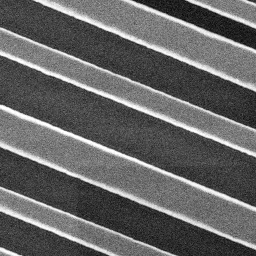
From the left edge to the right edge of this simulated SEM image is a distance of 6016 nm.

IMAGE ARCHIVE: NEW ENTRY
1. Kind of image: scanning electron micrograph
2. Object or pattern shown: lines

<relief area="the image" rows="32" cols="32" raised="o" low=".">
.....oooooooooooo.......oooooooo
........oooooooooooo.......ooooo
..........oooooooooooo.......ooo
.............oooooooooooo.......
ooo............ooooooooooooo....
ooooo.............oooooooooooo..
oooooooo............oooooooooooo
..oooooooo............oooooooooo
....oooooooo.............ooooooo
.......oooooooo............ooooo
.........ooooooooo............oo
............oooooooo............
..............ooooooooo.........
o................oooooooo.......
ooo................ooooooooo....
oooooo................oooooooo..
oooooooo................oooooooo
ooooooooooo................ooooo
ooooooooooooo................ooo
...ooooooooooooo................
.....ooooooooooooo..............
........ooooooooooooo...........
..........ooooooooooooo.........
.............ooooooooooooo......
ooo............ooooooooooooo....
oooooo............ooooooooooooo.
oooooooo............oooooooooooo
...oooooooo............ooooooooo
.....oooooooo............ooooooo
........oooooooo............oooo
..........oooooooo............oo
o............oooooooo...........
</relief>